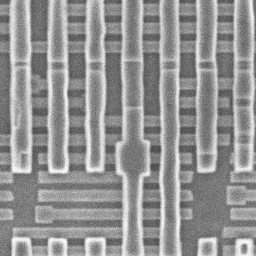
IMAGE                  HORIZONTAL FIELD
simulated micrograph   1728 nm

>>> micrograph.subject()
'wiring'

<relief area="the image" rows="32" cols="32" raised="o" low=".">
.ooo..oo...oo..ooo..oo...oo..oo.
.ooo..oo...oo..ooo..oo...oo..ooo
.ooo..oo...oo..ooo..oo...oo..ooo
.ooo..oo...oo..ooo..oo...oo..ooo
.ooo..oo...oo..ooo..oo...oo..ooo
.ooo..oo...oo..ooo..oo...oo..ooo
.ooo..oo...oo..ooo..oo...oo..ooo
.ooo..oo...oo..ooo..oo...oo..ooo
..oo..oo...oo..ooo..oo...oo..ooo
..oo..oo...oo..ooo..oo...oo..ooo
..oo..oo...oo..ooo..oo...oo..ooo
..oo..oo...oo..ooo..oo...oo..ooo
..oo..oo...oo..ooo..oo...oo..ooo
..oo..oo...oo...oo..oo...oo..ooo
..oo..oo...oo..ooo..oo...oo..ooo
..oo..oo...oo..ooo..oo...oo..ooo
.ooo..oo...oo..ooo..oo...oo..ooo
.ooo..oo...oo..ooo..oo...oo...o.
.ooo..oo...oo..oooo.oo...oo..oo.
..oo..oo...oo..oooo.oo...oo..ooo
..oo..oo...oo..oooo.oo...oo..oo.
...............oooo.oo..........
...............ooo..oo..........
................oo..oo..........
................oo..oo..........
................oo..oo..........
................oo..oo..........
................oo..oo..........
................oo..oo..........
................oo..oo..........
..oo..oo...oo..ooo..oo...oo...o.
..oo..oo...oo..ooo..oo...oo...o.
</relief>